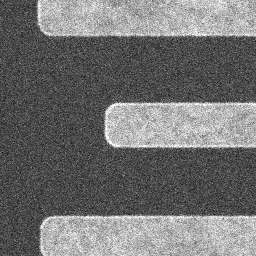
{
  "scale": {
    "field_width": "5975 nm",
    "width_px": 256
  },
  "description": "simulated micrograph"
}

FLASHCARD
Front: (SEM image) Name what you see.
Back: one or a few lines or trenches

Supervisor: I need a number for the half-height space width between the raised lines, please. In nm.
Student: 1640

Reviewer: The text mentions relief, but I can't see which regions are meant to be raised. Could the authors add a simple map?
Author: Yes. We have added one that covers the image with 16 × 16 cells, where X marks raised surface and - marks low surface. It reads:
--XXXXXXXXXXXXXX
--XXXXXXXXXXXXXX
----------------
----------------
----------------
----------------
----------------
-------XXXXXXXXX
-------XXXXXXXXX
----------------
----------------
----------------
----------------
----------------
---XXXXXXXXXXXXX
---XXXXXXXXXXXXX